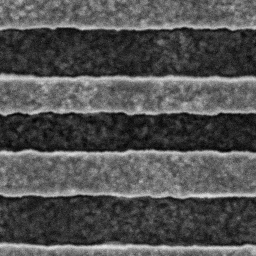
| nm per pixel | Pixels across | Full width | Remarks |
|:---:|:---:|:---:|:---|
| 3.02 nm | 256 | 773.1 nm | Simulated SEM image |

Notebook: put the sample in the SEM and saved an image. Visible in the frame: lines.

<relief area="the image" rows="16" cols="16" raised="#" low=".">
################
################
................
................
................
################
################
................
................
##......###.##..
################
################
................
................
................
################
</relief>